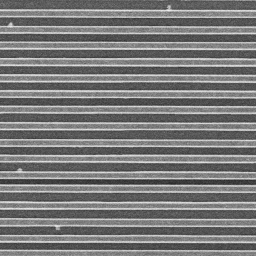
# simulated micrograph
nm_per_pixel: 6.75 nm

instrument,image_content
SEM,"parallel lines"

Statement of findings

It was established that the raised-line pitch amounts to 108 nanometers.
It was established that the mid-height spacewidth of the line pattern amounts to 61.6 nm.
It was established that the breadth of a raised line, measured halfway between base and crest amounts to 49.8 nanometers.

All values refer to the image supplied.